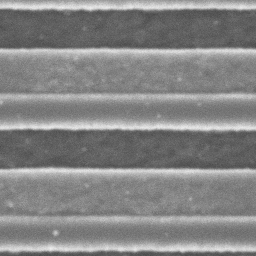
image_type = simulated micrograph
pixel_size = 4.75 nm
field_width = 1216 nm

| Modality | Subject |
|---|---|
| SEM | lines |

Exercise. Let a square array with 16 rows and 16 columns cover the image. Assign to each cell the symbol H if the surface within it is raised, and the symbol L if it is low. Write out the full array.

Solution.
HHHHHHHHHHHHHHHH
LLLLLLLLLLLLLLLL
LLLLLLLLLLLLLLLL
HHHHHHHHHHHHHHHH
HHHHHHHHHHHHHHHH
HHHHHHHHHHHHHHHH
HHHHHHHHHHHHHHHH
HHHHHHHHHHHHHHHH
LLLLLLLLLLLLLLLL
LLLLLLLLLLLLLLLL
LLLLLLLLLLLLLLLL
HHHHHHHHHHHHHHHH
HHHHHHHHHHHHHHHH
HHHHHHHHHHHHHHHH
HHHHHHHHHHHHHHHH
HHHHHHHHHHHHHHHH